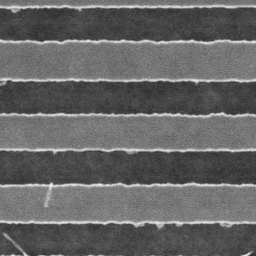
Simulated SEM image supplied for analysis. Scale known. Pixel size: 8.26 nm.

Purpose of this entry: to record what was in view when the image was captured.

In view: lines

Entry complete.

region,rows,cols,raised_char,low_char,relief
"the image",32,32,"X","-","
XXXXXXXXXXXXXXXXXXXXXXXXXXXXXXXX
--------------------------------
--------------------------------
--------------------------------
--------------------------------
XXXXXXXXXXXXXXXXXXXXXXXXXXXXXXXX
XXXXXXXXXXXXXXXXXXXXXXXXXXXXXXXX
XXXXXXXXXXXXXXXXXXXXXXXXXXXXXXXX
XXXXXXXXXXXXXXXXXXXXXXXXXXXXXXXX
XXXXXXXXXXXXXXXXXXXXXXXXXXXXXXXX
--------------------------------
--------------------------------
--------------------------------
--------------------------------
XXXXXXXXXXXXXXXXXXXXXXXXXXXXXXXX
XXXXXXXXXXXXXXXXXXXXXXXXXXXXXXXX
XXXXXXXXXXXXXXXXXXXXXXXXXXXXXXXX
XXXXXXXXXXXXXXXXXXXXXXXXXXXXXXXX
XXXXXXXXXXXXXXXXXXXXXXXXXXXXXXXX
--------------------------------
--------------------------------
--------------------------------
--------------------------------
XXXXXXXXXXXXXXXXXXXXXXXXXXXXXXXX
XXXXXXXXXXXXXXXXXXXXXXXXXXXXXXXX
XXXXXXXXXXXXXXXXXXXXXXXXXXXXXXXX
XXXXXXXXXXXXXXXXXXXXXXXXXXXXXXXX
XXXXXXXXXXXXXXXXXXXXXXXXXXXXXXXX
--------------------------------
--------------------------------
--------------------------------
--------------------------------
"